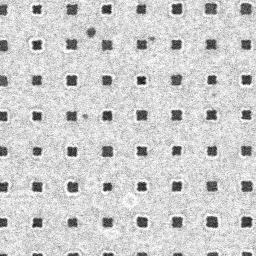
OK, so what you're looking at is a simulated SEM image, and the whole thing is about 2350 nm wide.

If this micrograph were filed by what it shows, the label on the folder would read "a regular array of holes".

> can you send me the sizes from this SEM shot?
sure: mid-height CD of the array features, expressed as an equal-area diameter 104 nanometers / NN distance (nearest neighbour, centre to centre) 319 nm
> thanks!